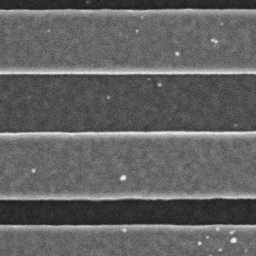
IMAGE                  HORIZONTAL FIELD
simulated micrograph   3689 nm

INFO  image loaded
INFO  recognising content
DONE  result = lines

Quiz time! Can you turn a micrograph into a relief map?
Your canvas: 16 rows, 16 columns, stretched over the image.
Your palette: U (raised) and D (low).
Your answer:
DDDDDDDDDDDDDDDD
UUUUUUUUUUUUUUUU
UUUUUUUUUUUUUUUU
UUUUUUUUUUUUUUUU
UUUUUUUUUUUUUUUU
DDDDDDDDDDDDDDDD
DDDDDDDDDDDDDDDD
DDDDDDDDDDDDDDDD
UUUUUUUUUUUUUUUU
UUUUUUUUUUUUUUUU
UUUUUUUUUUUUUUUU
UUUUUUUUUUUUUUUU
DDDDDDDDDDDDDDDD
DDDDDDDDDDDDDDDD
UUUUUUUUUUUUUUUU
UUUUUUUUUUUUUUUU